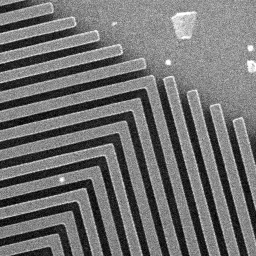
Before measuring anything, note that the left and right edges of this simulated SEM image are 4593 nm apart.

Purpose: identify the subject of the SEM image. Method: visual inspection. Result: groups of lines, slits or small figures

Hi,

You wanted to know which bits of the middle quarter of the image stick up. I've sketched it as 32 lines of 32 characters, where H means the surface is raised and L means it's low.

HHLLLLLLLLLHHHHHHHHHLLLLLLLLLLLL
LLLLLLLHHHHHHHHHHHHLLLLLLLLLLLLL
LLLHHHHHHHHHHHLLLLLLLLLLLLLLLLLL
HHHHHHHHHHLLLLLLLLLHHHLLLHHLLLLL
HHHHHHLLLLLLLLLHHHHHHHHLLHHHLLLL
HLLLLLLLLLLHHHHHHHHHHHHLLHHHLLLL
LLLLLLHHHHHHHHHHHHLLLHHLLHHHLLLL
LLLHHHHHHHHHHHLLLLLLLHHHLLHHLLLH
HHHHHHHHHHLLLLLLLLLLLHHHLLHHHLLH
HHHHHLLLLLLLLLLHHHHLLHHHLLHHHLLH
HLLLLLLLLLHHHHHHHHHHLLHHLLLHHLLH
LLLLLLHHHHHHHHHHHHHHLLHHHLLHHLLL
LLHHHHHHHHHHHLLLLHHHLLHHHLLHHHLL
HHHHHHHHHLLLLLLLLLHHLLHHHLLHHHLL
HHHHHLLLLLLLLLHLLLHHLLLHHLLLHHLL
HLLLLLLLLLHHHHHHLLHHHLLHHHLLHHLL
LLLLLLHHHHHHHHHHLLLHHLLHHHLLHHHL
LLHHHHHHHHHHLLHHLLLHHLLHHHLLHHHL
HHHHHHHHLLLLLLHHHLLHHLLLHHLLLHHL
HHHHLLLLLLLLLLHHHLLHHHLLHHHLLHHH
LLLLLLLLLHHHLLLHHLLLHHLLHHHLLHHH
LLLLHHHHHHHHHLLHHHLLHHLLLHHLLHHH
HHHHHHHHHHHHHLLHHHLLHHLLLHHLLLHH
HHHHHHHLLLLHHLLLHHLLHHHLLHHHLLHH
HHHLLLLLLLLHHHLLHHLLHHHLLHHHLLHH
LLLLLLLLLLLHHHLLHHHLLHHLLLHHLLHH
LLLLHHHHHLLHHHLLHHHLLHHHLLHHHLLH
HHHHHHHHHLLLHHLLHHHLLHHHLLHHHLLH
HHHHHHHHHHLLHHHLLHHHLHHHLLHHHLLH
HHLLLLLHHHLLHHHLLHHHLLHHLLLHHLLL
LLLLLLLHHHLLHHHLLHHHLLHHHLLHHHLL
LLLHHHLLHHLLLHHLLLHHLLHHHLLHHHLL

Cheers